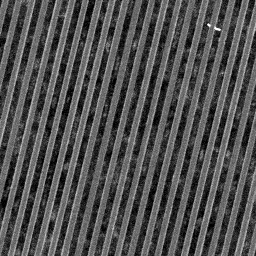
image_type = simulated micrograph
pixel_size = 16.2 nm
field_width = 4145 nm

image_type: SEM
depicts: parallel lines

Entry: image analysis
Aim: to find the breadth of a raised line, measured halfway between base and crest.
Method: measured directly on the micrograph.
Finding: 82.6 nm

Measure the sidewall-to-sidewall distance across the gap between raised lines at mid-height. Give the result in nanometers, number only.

124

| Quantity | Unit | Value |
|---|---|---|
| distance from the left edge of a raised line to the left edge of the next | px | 13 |